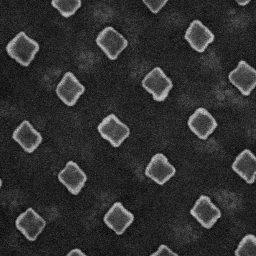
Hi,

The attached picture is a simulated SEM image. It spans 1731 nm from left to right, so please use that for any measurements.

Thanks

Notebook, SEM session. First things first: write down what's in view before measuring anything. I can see a regular array of raised bodies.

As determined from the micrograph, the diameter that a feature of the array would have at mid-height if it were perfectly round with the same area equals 170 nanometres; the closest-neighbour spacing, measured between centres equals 410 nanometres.